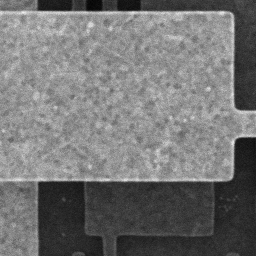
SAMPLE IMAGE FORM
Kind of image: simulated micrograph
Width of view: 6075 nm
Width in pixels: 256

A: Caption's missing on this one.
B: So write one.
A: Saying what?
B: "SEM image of wiring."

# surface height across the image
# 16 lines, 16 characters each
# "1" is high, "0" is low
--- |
0000000000000000
1111111111111110
1111111111111110
1111111111111110
1111111111111110
1111111111111110
1111111111111110
1111111111111111
1111111111111111
1111111111111110
1111111111111110
0000000000000000
0000000000000000
0000000000000000
0000000000000000
0000000000000000